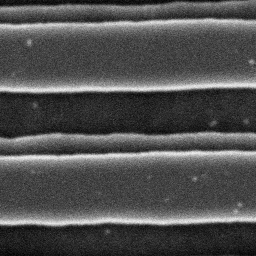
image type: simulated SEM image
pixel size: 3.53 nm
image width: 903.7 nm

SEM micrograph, lines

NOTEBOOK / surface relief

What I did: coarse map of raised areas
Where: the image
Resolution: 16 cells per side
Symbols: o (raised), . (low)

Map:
................
..oooooooooooooo
oooooooooooooooo
oooooooooooooooo
oooooooooooooooo
oooooooooooo....
................
................
................
...........oooo.
oooooooooooooooo
oooooooooooooooo
oooooooooooooooo
oooooooooooooooo
................
................